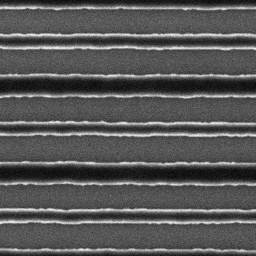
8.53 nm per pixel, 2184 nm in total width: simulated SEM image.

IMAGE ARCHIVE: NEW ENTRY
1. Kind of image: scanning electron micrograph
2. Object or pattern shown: lines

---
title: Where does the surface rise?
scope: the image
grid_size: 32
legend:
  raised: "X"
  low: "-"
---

XXXXXXXXXXXXXXXXXXXXXXXXXXXXXXXX
--------------------------------
--------------------------------
--------------------------------
XXXXXXXXXXXXXXXXXXXXXXXXXXXXXXXX
XXXXXXXXXXXXXXXXXXXXXXXXXXXXXXXX
--------------------------------
--------------------------------
--------------------------------
XXXXXXXXXXXXXXXXX-XXXXXXXXXXX-XX
XXXXXXXXXXXXXXXXXXXXXXXXXXXXXXXX
XXXXXXXXXXXXXXXXXXXXXXXXXXXXXXXX
--------------------------------
--------------------------------
--------------------------------
XXXXXXXXXXXXXXXXXXXXXXXXXXXXXXXX
XXXXXXXXXXXXXXXXXXXXXXXXXXXXXXXX
--------------------------------
--------------------------------
--------------------------------
XXXXXXXXXXXXXXXXXXXXXXXXXXXXXXXX
XXXXXXXXXXXXXXXXXXXXXXXXXXXXXXXX
XXXXXXXXXXXXXXXXXXXXXXXXXXXXXXXX
--------------------------------
--------------------------------
--------------------------------
XXXXXXXXXXXXXXXXXXXXXXXXXXXXXXXX
XXXXXXXXXXXXXXXXXXXXXXXXXXXXXXXX
--------------------------------
--------------------------------
--------------------------------
XXXXXXXXXXXXXXXXXXXXXXXXXXXXXXXX